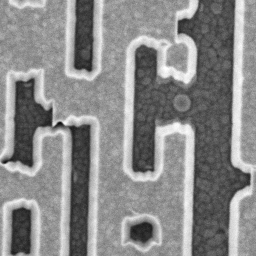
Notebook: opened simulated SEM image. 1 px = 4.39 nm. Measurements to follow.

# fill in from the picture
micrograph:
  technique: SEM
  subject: one or a few lines or trenches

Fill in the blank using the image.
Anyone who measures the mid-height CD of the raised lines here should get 143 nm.